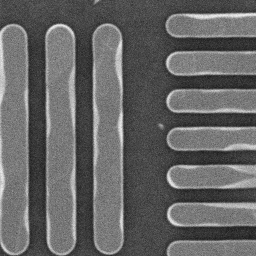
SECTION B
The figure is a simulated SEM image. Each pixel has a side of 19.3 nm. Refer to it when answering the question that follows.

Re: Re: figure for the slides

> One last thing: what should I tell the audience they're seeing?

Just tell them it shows groups of lines, slits or small figures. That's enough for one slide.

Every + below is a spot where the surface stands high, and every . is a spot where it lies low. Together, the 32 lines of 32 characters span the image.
................................
................................
.....................+++++++++++
.++...+++...+++......+++++++++++
+++...+++...+++.......++++++++++
+++...+++...+++.................
+++...+++...+++.................
+++...+++...+++......+++++++++++
+++...+++...+++......+++++++++++
+++...+++...+++.................
+++...+++...+++.................
+++...+++...+++.......++++++++++
+++...+++...+++......+++++++++++
+++...+++...+++......+++++++++++
+++...+++...+++.................
+++...+++...+++.................
+++...+++...+++......+++++++++++
+++...+++...+++......+++++++++++
+++...+++...+++.......+++++++...
+++...+++...+++.................
+++...+++...+++.................
++++..+++...+++......+++++++++++
++++..+++...+++......+++++++++++
+++...+++...+++.................
+++...+++...+++.................
+++...+++...+++.......++++......
+++...+++...+++......+++++++++++
+++...+++...+++......+++++++++++
++++..+++...+++.................
++++..+++...+++.................
++++..+++...+++.......++++++++++
.++....++....++......+++++++++++